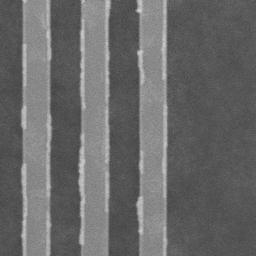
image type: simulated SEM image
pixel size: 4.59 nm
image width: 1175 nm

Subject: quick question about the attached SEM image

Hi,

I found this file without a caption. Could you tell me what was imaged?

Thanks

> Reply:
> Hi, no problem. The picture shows parallel lines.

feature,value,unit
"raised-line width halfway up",28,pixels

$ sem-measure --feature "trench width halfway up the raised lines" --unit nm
142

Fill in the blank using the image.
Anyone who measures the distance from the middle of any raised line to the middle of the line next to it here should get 267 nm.